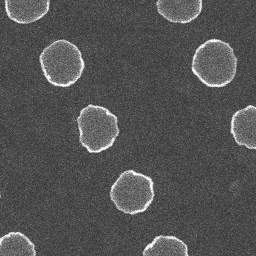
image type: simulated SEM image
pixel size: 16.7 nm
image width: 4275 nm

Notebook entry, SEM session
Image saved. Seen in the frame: raised bodies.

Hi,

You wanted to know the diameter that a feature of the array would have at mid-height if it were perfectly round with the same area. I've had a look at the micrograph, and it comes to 732 nm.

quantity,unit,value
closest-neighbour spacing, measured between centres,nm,1230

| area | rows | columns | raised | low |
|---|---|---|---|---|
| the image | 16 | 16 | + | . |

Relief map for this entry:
+++.......+++...
................
................
...++.......+++.
...++.......+++.
................
................
.....++........+
.....++........+
................
................
.......+++......
.......++.......
................
................
++.......+++....